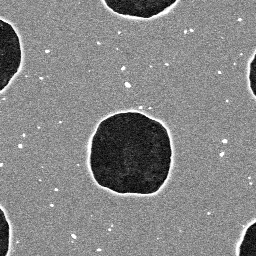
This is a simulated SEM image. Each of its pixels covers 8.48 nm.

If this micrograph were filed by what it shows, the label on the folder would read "holes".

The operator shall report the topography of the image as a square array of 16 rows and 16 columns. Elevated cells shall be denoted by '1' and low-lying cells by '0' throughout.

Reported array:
1111111000111111
1111111111111111
0111111111111111
0111111111111111
0111111111111111
1111111111111111
1111111111111111
1111111000111111
1111110000011111
1111110000011111
1111110000011111
1111110000111111
1111111111111111
1111111111111111
0111111111111110
0111111111111110